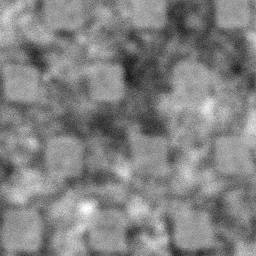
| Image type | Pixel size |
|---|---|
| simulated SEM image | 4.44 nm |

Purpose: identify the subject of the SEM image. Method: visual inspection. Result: a regular array of raised bodies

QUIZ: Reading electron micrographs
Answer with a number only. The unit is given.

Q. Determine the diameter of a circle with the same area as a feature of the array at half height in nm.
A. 177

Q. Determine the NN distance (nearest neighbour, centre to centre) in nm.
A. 375